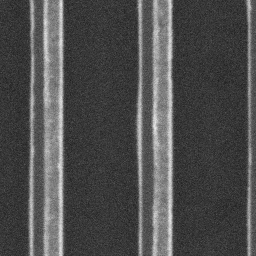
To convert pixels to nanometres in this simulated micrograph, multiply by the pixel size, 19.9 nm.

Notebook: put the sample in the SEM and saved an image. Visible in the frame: lines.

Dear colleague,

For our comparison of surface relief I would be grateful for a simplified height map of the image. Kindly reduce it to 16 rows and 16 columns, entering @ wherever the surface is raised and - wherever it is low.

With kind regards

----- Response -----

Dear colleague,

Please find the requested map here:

--@@-----@@-----
--@@-----@@-----
--@@-----@@-----
--@@-----@@-----
--@@-----@@-----
--@@-----@@-----
--@@-----@@-----
--@@-----@@-----
--@@-----@@-----
--@@-----@@-----
--@@-----@@-----
--@@-----@@-----
--@@-----@@-----
--@@-----@@-----
--@@-----@@-----
--@@-----@@-----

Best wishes